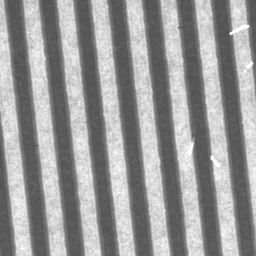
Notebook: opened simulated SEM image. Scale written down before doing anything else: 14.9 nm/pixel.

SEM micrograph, parallel lines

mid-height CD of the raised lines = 259 nm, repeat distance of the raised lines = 509 nm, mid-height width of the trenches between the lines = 244 nm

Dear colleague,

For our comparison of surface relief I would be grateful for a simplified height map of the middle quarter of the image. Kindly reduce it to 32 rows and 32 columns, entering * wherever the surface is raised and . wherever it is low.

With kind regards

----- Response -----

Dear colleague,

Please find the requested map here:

****....*****....****.....****..
****....*****....****.....****..
****.....****....*****....****..
*****....****....*****....****..
*****....****.....****....****..
*****....****.....****....*****.
*****....****.....****....*****.
.****....*****....****....*****.
.****....*****....****.....****.
.****.....****....****.....****.
.****.....****....*****....****.
.****.....****....*****....****.
.*****....****....*****....****.
..****....****.....****....****.
.*****....****.....****....*****
.*****....****.....****....*****
..****....*****....****.....****
..****....*****....****.....****
..****....*****....****.....****
..****....*****....*****....****
..****.....****....****.....****
..*****....****....*****....****
..*****....****.....****....****
...****....****.....****....****
...****....****.....****....****
...****....*****....****.....***
...****....*****....****.....***
...****....*****....****.....***
...****....*****....*****....***
...****.....****....*****....***
...*****....****....*****....***
...*****....****....*****....***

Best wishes